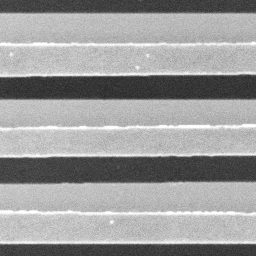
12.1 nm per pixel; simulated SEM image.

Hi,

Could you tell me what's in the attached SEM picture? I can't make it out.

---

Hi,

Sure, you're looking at lines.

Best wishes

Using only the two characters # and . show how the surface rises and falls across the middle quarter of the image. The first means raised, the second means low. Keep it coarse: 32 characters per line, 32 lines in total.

################################
################################
################################
................................
................................
................................
................................
................................
................................
################################
################################
################################
################################
################################
################################
################################
################################
################################
################################
################################
################################
################################
################################
................................
................................
................................
................................
................................
................................
................................
################################
################################